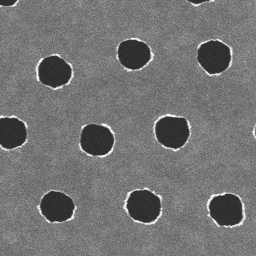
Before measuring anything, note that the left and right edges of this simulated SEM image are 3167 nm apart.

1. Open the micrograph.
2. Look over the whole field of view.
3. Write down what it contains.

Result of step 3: a regular array of holes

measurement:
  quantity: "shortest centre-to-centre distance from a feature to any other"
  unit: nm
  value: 988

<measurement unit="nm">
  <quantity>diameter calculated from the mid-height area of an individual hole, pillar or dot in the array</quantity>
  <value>409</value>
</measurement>